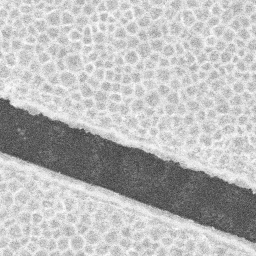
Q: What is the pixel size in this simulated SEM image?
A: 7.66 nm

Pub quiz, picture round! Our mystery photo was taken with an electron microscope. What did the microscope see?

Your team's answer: one or a few lines or trenches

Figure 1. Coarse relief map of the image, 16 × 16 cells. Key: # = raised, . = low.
################
################
################
################
################
################
..##############
....############
........########
..........######
##...........###
####............
#######.........
##########......
#############...
###############.